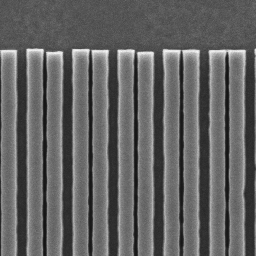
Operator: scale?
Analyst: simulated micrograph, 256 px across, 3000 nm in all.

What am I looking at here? parallel lines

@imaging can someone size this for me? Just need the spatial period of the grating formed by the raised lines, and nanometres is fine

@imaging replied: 267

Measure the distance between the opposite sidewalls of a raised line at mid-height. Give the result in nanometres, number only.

188